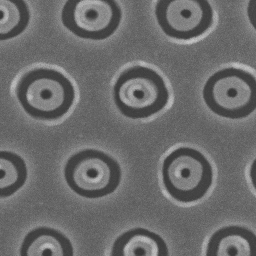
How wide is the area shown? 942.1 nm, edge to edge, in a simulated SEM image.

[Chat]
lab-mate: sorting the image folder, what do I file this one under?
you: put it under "ring-shaped grooves with a dot in the middle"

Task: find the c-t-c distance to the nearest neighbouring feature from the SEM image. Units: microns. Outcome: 0.341